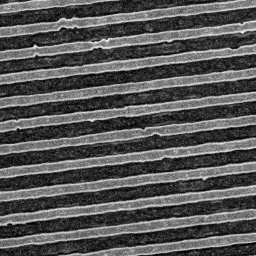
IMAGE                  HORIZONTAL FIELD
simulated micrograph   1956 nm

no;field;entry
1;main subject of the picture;parallel lines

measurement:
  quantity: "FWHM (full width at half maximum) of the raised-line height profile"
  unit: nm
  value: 68.3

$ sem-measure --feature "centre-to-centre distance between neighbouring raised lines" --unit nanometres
178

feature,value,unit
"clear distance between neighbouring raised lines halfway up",105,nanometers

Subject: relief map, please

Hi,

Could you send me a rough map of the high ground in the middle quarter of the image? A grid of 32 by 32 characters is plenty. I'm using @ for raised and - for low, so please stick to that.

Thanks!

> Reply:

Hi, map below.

-----@@@@@@@@@@@@@@@@@----------
@@@@@@@@@@@@@@@-----------------
@@@@----------------------------
---------------------------@@@@@
--------------------@@@@@@@@@@@@
------------@@@@@@@@@@@@@@@@@---
---@@@@@@@@@@@@@@@@@@-----------
@@@@@@@@@@@@--------------------
@@@@@@--------------------------
----------------------------@@@@
-------------------@@@@@@@@@@@@@
-----------@@@@@@@@@@@@@@@@@----
-@@@@@@@@@@@@@@@@@@@------------
@@@@@@@@@@@---------------------
@@@-----------------------------
-------------------------@@@@@@@
---------------@@@@@@@@@@@@@@@@@
--------@@@@@@@@@@@@@@@@@@@@----
@-@@@@@@@@@@@@@@@---------------
@@@@@@@@@@----------------------
--------------------------------
------------------------@@@@@@@@
----------------@@@@@@@@@@@@@@@@
--------@@@@@@@@@@@@@@@@@-------
@@@@@@@@@@@@@@@@@---------------
@@@@@@@@------------------------
--------------------------------
------------------------@@@@@@@@
---------------@@@@@@@@@@@@@@@@@
-------@@@@@@@@@@@@@@@@@--------
@@@@@@@@@@@@@@@@@@--------------
@@@@@@@@@-----------------------